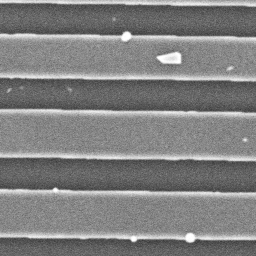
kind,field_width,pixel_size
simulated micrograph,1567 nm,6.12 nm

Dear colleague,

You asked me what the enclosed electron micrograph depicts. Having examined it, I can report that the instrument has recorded lines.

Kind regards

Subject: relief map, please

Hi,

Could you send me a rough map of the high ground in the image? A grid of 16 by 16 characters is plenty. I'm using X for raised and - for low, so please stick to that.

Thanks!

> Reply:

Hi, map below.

----------------
----------------
XXXXXXXXXXXXXXXX
XXXXXXXXXXXXXXXX
XXXXXXXXXXXXXXXX
----------------
----------------
XXXXXXXXXXXXXXXX
XXXXXXXXXXXXXXXX
XXXXXXXXXXXXXXXX
----------------
----------------
XXXXXXXXXXXXXXXX
XXXXXXXXXXXXXXXX
XXXXXXXXXXXXXXXX
----------------